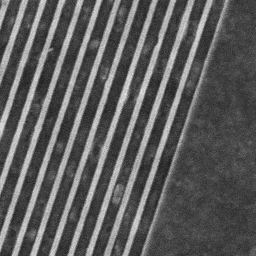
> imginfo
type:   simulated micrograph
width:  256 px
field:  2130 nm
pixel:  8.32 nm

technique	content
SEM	parallel lines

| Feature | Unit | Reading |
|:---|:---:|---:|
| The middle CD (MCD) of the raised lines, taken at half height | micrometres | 0.0414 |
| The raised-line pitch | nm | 146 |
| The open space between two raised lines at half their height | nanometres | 105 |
